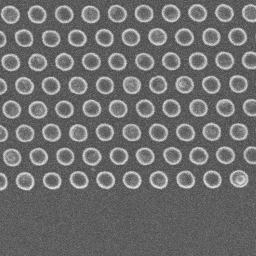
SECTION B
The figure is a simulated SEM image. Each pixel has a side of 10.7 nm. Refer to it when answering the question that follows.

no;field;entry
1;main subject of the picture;a regular array of raised bodies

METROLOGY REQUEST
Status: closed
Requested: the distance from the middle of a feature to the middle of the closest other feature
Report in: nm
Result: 282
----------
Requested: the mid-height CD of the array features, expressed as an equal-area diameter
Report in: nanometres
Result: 177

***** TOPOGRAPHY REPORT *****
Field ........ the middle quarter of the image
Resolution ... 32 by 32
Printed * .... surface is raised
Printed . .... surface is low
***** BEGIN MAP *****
**...****...***....***...****...
................................
................................
.........**.....**....***....**.
..***....***...****...***...****
..****..****...****...***...****
..***....***...****...***....***
................................
................................
.....***....***....**....***....
**...****...***...****...****...
**...****...****..****...****...
**....***...***....***....**....
................................
................................
..**.....**.....**....***....**.
..***...****...****...****..****
..****..****...****...****..****
..***....***....***...***....***
................................
................................
**....**....***....**.....**....
**...****...****..****...****...
**...****...****..****...****...
**....***...***....***....***...
................................
................................
..***....***....**....***....***
..****..****...****...****..****
..****..****...****...****..****
...**....***....***....**....***
................................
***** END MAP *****